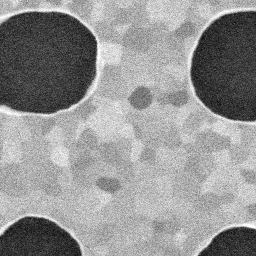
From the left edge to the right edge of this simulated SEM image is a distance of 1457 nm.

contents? holes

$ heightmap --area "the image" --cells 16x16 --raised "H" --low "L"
HHHHHHHHHHHHHHHH
LLLLLHHHHHHHHLLL
LLLLLLHHHHHHLLLL
LLLLLLHHHHHHLLLL
LLLLLLHHHHHHLLLL
LLLLLLHHHHHHLLLL
LLLLLHHHHHHHHLLL
HHHHHHHHHHHHHHLL
HHHHHHHHHHHHHHHH
HHHHHHHHHHHHHHHH
HHHHHHHHHHHHHHHH
HHHHHHHHHHHHHHHH
HHHHHHHHHHHHHHHH
HHHHHHHHHHHHHHHH
LLLLHHHHHHHHHHLL
LLLLLHHHHHHHHLLL